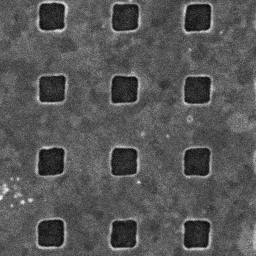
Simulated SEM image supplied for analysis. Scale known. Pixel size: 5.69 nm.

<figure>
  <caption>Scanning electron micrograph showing a regular array of holes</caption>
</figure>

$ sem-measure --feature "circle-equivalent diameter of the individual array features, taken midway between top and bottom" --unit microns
0.172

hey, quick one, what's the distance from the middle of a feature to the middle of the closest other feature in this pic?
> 0.41 um